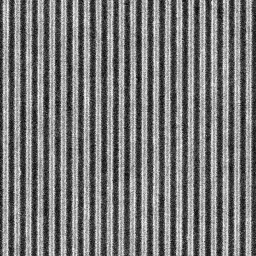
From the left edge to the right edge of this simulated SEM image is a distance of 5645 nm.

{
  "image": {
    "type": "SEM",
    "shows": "parallel lines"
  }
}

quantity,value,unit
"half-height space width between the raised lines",74.4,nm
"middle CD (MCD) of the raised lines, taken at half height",182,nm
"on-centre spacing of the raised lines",256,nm